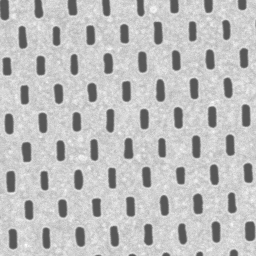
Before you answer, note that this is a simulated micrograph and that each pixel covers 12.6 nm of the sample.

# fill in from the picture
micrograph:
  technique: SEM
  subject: a regular array of holes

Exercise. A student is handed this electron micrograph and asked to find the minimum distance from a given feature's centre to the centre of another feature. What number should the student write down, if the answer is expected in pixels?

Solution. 33.1